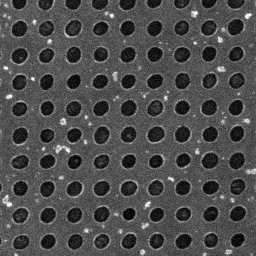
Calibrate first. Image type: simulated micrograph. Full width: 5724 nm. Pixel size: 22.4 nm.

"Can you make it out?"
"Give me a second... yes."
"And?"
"a regular array of holes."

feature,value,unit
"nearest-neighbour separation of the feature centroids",587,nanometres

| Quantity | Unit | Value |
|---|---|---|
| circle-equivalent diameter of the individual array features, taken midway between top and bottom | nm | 356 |